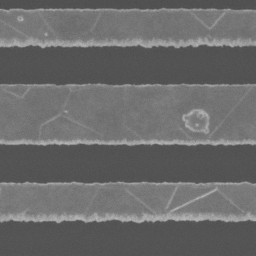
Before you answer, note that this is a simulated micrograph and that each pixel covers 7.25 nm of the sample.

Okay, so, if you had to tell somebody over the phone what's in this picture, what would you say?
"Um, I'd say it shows lines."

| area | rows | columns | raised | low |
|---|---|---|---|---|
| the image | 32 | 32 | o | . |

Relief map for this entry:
................................
oooooooooooooooooooooooooooooooo
oooooooooooooooooooooooooooooooo
oooooooooooooooooooooooooooooooo
oooooooooooooooooooooooooooooooo
ooooooooooooooooooooooooo.oooooo
................................
................................
................................
................................
............o...................
oooooooooooooooooooooooooooooooo
oooooooooooooooooooooooooooooooo
oooooooooooooooooooooooooooooooo
oooooooooooooooooooooooooooooooo
oooooooooooooooooooooooooooooooo
oooooooooooooooooooooooooooooooo
oooooooooooooooooooooooooooooooo
................................
................................
................................
................................
................................
oooooooooooooooooooooooooooooooo
oooooooooooooooooooooooooooooooo
oooooooooooooooooooooooooooooooo
oooooooooooooooooooooooooooooooo
o..ooo.o..ooo..ooo.oo.......oo..
................................
................................
................................
................................